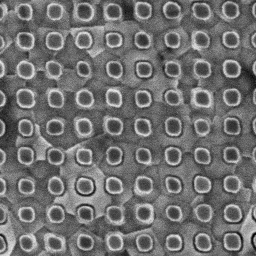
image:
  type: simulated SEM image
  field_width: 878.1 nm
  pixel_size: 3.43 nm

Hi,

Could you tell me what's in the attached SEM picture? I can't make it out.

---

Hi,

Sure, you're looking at a regular array of raised bodies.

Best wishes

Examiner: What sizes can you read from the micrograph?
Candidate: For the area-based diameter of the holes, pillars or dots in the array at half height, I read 56.2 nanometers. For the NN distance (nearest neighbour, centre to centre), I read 97.5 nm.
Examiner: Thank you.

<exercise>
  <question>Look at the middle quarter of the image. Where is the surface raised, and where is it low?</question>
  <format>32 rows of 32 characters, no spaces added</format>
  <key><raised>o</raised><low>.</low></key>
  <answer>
...ooo.....ooo....oooo...oooo...
...oooo....oooo...oooo...oooo...
....ooo....oooo...oooo....ooo...
................................
................................
................................
...........oo...................
...oooo....ooo....ooo....oooo...
...oooo....ooo....oooo...oooo...
...oooo....ooo....oooo....ooo...
....ooo.....oo.....oo...........
................................
................................
................................
...oooo....ooo....ooo....oooo...
...oooo....oooo...oooo....ooo...
...oooo....ooo....oooo....ooo...
....oo.............oo.....ooo...
................................
................................
................................
....oo.....ooo....ooo.....ooo...
...oooo....ooo....oooo...oooo...
...oooo....ooo....oooo....ooo...
....ooo....ooo.....oo.....ooo...
................................
................................
................................
............o......oo.....oo....
...oooo....ooo....oooo....ooo...
...oooo....oooo...oooo....ooo...
...oooo....oooo...oooo....ooo...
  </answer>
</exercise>